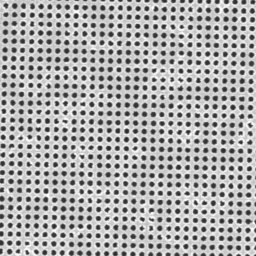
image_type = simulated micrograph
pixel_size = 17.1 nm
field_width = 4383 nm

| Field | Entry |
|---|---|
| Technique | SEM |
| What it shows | a regular array of holes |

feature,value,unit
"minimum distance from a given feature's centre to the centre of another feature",146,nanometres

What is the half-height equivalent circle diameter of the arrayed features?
0.1 um